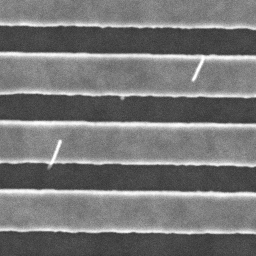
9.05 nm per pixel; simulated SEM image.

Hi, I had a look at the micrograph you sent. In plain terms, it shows lines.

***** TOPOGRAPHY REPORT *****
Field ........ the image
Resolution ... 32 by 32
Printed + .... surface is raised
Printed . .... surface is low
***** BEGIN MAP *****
++++++++++++++++++++++++++++++++
++++++++++++++++++++++++++++++++
++++++++++++++++++++++++++++++++
.......................+....++.+
................................
................................
................................
++++++++++++++++++++++++++++++++
++++++++++++++++++++++++++++++++
++++++++++++++++++++++++++++++++
++++++++++++++++++++++++++++++++
++++++++++++++++++++++++++++++++
................................
................................
................................
+++++++++++++++++++++.+.........
++++++++++++++++++++++++++++++++
++++++++++++++++++++++++++++++++
++++++++++++++++++++++++++++++++
++++++++++++++++++++++++++++++++
.....................+++++++++++
................................
................................
................................
++++++++++++++++++++++++++++++++
++++++++++++++++++++++++++++++++
++++++++++++++++++++++++++++++++
++++++++++++++++++++++++++++++++
++++++++++++++++++++++++++++++++
................................
................................
................................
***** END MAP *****